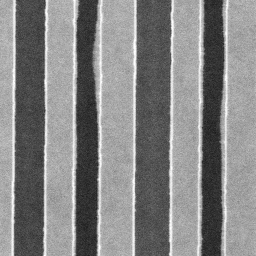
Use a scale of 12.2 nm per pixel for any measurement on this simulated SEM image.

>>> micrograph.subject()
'lines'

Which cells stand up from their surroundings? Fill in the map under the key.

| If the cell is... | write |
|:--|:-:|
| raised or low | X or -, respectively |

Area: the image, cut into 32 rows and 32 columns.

XX----XXX----XXXX-----XXX---XXXX
XX----XXX----XXXX-----XXX---XXXX
XX----XXX----XXXX-----XXX---XXXX
XX----XXX---XXXXX-----XXX---XXXX
XX----XXX---XXXXX-----XXX---XXXX
XX----XXX---XXXXX-----XXX---XXXX
XX----XXX---XXXXX-----XXX---XXXX
XX----XXX---XXXXX-----XXX---XXXX
XX----XXX---XXXXX-----XXX---XXXX
XX----XXX---XXXXX-----XXX---XXXX
XX----XXX---XXXXX-----XXX---XXXX
XX----XXX---XXXXX-----XXX---XXXX
XX----XXX---XXXXX-----XXX---XXXX
XX----XXX---XXXXX-----XXX---XXXX
XX----XXX---XXXXX-----XXX---XXXX
XX----XXX---XXXXX----XXXX---XXXX
XX----XXX---XXXXX-----XXX---XXXX
XX----XXX---XXXXX----XXXX---XXXX
XX----XXX---XXXXX----XXXX---XXXX
XX----XXX---XXXXX----XXXX---XXXX
XX----XXX---XXXXX----XXXX---XXXX
XX----XXX---XXXXX----XXXX---XXXX
XX----XXX---XXXXX----XXXX---XXXX
XX----XXX---XXXXX----XXXX---XXXX
XX----XXX---XXXXX----XXXX---XXXX
XX----XXX---XXXXX----XXXX---XXXX
XX----XXX---XXXXX----XXXX---XXXX
XX----XXX---XXXXX----XXXX---XXXX
XX----XXX---XXXXX----XXXX---XXXX
XX----XXX---XXXXX----XXXX---XXXX
XX----XXX---XXXXX----XXXX---XXXX
XX----XXX---XXXXX----XXXX---XXXX